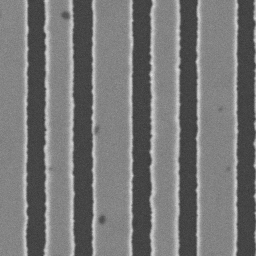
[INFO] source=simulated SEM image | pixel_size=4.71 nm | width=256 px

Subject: lines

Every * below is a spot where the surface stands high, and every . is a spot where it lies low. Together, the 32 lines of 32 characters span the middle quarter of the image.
**.....**********.....*******...
**.....**********.....*******...
**.....**********.....*******...
**.....**********.....*******...
**.....**********.....*******...
**.....**********.....*******...
**.....**********.....*******...
**.....**********.....*******...
**.....**********.....*******...
**.....**********.....*******...
***....**********.....*******...
**.....**********.....*******...
**.....**********.....*******...
**.....**********.....*******...
**.....**********.....*******...
**.....**********.....*******...
**.....**********.....*******...
**.....**********.....*******...
**.....**********.....*******...
**.....**********.....*******...
**.....**********.....*******...
**.....**********.....*******...
**.....**********.....*******...
**.....**********.....*******...
**.....**********.....*******...
**.....**********.....*******...
**.....**********.....*******...
**.....**********.....*******...
**.....**********.....*******...
**.....**********.....*******...
**.....**********.....*******...
**.....**********.....*******...